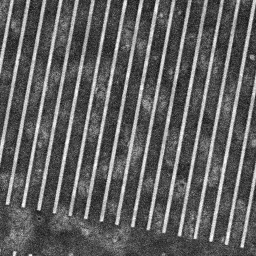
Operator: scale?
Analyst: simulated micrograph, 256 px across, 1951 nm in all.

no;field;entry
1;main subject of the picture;parallel lines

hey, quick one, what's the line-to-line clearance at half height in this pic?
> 0.103 um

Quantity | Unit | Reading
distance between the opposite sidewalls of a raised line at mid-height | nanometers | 21.6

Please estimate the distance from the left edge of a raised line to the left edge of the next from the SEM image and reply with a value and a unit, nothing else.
121 nm